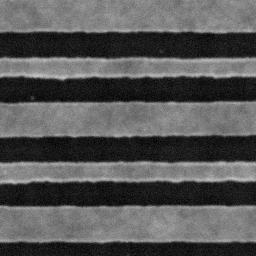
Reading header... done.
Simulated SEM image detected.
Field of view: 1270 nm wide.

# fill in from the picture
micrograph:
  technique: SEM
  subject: lines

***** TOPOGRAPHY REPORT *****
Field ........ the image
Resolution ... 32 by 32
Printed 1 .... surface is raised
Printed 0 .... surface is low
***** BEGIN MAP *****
11111111111111111111111111111111
11111111111111111111111111111111
11111111111111111111111111111111
11111111111111111111111111111111
00000000000000000000000000000000
00000000000000000000000000000000
00000000000000000000000000000000
11111111111111111111111011111111
11111111111111111111111111111111
10011111111111111111110010111011
00000000000000000000000000000000
00000000000000000000000000000000
00000000000000000000000000000000
11111111111111111111111111111111
11111111111111111111111111111111
11111111111111111111111111111111
11111111111111111111111111111111
00000000000000000000000000000000
00000000000000000000000000000000
00000000000000000000000000000000
11111111111111111111111111111111
11111111111111111111111111111111
11111111111111111111111111111111
00000000000000000000000000000000
00000000000000000000000000000000
00000000000000000000000000000000
11111111111111111111111111111111
11111111111111111111111111111111
11111111111111111111111111111111
11111111111111111111111111111111
00000000000000000000000000000000
00000000000000000000000000000000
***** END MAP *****